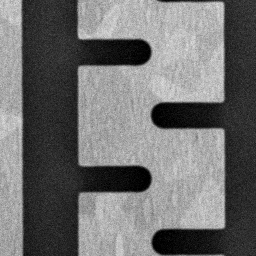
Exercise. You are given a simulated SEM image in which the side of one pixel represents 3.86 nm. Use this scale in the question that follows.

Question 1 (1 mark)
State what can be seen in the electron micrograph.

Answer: groups of lines, slits or small figures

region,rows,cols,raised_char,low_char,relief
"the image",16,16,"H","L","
HLLLLHHHHHHHHHLL
HLLLLHHHHHHHHHLL
HLLLLLLLLHHHHHLL
HLLLLLLLLHHHHHLL
HLLLLHHHHHHHHHLL
HLLLLHHHHHHHHHLL
HLLLLHHHHHLLLLLL
HLLLLHHHHHLLLLLL
HLLLLHHHHHHHHHLL
HLLLLHHHHHHHHHLL
HLLLLLLLLHHHHHLL
HLLLLLLLLHHHHHLL
HLLLLHHHHHHHHHLL
HLLLLHHHHHHHHHLL
HLLLLHHHHHLLLLLL
HLLLLHHHHHLLLLLL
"